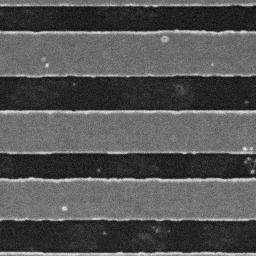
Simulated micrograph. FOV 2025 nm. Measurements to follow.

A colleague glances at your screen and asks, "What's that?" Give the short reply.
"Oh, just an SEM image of lines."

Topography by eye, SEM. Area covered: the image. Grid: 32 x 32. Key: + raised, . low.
++++++++++++++++++++++++++++++++
................................
................................
................................
++++++++++++++++++++++++++++++++
++++++++++++++++++++++++++++++++
++++++++++++++++++++++++++++++++
++++++++++++++++++++++++++++++++
++++++++++++++++++++++++++++++++
...+++.....+...++...............
................................
................................
................................
................................
++++++++++++++++++++++++++++++++
++++++++++++++++++++++++++++++++
++++++++++++++++++++++++++++++++
++++++++++++++++++++++++++++++++
++++++++++++++++++++++++++++++++
................................
................................
................................
++++++++++++++++++++++++++++++++
++++++++++++++++++++++++++++++++
++++++++++++++++++++++++++++++++
++++++++++++++++++++++++++++++++
++++++++++++++++++++++++++++++++
+++.++++.....+++...++++.+++++++.
................................
................................
................................
................................